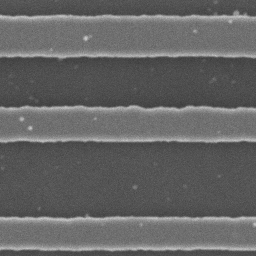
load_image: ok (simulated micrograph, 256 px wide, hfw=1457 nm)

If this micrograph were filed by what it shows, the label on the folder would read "lines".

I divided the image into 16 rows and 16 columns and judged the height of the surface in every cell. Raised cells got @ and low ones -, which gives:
----------------
@@@@@@@@@@@@@@@@
@@@@@@@@@@@@@@@@
@@-@@@-@@@@--@@@
----------------
----------------
----------------
@@@@@@@@@@@@@@@@
@@@@@@@@@@@@@@@@
----------------
----------------
----------------
----------------
----------------
@@@@@@@@@@@@@@@@
@@@@@@@@@@@@@@@@